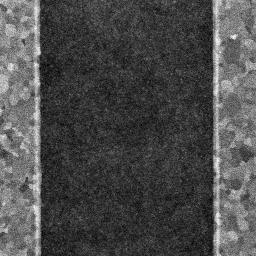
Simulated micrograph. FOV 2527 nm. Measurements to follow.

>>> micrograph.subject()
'one or a few lines or trenches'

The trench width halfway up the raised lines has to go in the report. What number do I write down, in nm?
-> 1780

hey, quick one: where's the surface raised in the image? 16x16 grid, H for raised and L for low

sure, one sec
HHLLLLLLLLLLLLHH
HHLLLLLLLLLLLLHH
HHLLLLLLLLLLLLHH
HHLLLLLLLLLLLLHH
HHLLLLLLLLLLLLHH
HHLLLLLLLLLLLLHH
HHLLLLLLLLLLLLHH
HHLLLLLLLLLLLLHH
HHLLLLLLLLLLLLHH
HHLLLLLLLLLLLLHH
HHLLLLLLLLLLLLHH
HHLLLLLLLLLLLLHH
HHLLLLLLLLLLLLHH
HHLLLLLLLLLLLLHH
HHLLLLLLLLLLLLHH
HHLLLLLLLLLLLLHH